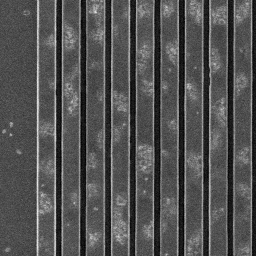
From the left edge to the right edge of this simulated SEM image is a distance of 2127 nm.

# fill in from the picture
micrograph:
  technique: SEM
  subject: parallel lines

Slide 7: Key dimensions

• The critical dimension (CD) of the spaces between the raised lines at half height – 0.053 micrometres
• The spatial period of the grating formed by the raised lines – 204 nm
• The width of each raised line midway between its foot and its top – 153 nm